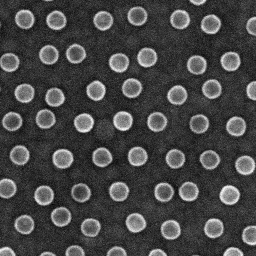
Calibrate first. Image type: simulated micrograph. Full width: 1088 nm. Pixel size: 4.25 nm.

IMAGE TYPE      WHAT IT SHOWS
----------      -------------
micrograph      a regular array of raised bodies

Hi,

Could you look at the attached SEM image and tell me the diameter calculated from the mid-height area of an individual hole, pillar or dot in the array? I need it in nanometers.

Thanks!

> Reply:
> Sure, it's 78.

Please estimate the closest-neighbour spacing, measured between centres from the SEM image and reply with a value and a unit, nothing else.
134 nm